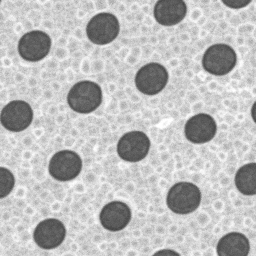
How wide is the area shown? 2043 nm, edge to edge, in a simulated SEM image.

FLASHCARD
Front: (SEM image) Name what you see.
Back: a regular array of holes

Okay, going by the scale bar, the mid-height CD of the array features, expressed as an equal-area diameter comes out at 262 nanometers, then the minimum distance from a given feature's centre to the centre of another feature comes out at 69.2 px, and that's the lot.